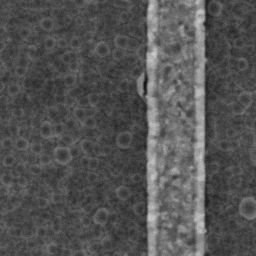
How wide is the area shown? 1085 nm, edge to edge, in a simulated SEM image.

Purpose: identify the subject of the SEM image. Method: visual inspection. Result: one or a few lines or trenches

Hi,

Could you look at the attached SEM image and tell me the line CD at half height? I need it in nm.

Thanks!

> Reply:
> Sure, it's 210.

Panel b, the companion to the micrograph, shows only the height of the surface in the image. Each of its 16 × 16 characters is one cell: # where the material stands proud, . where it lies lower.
.........####...
.........####...
.........####...
.........####...
.........####...
.........####...
.........####...
..........###...
..........###...
.........####...
.........####...
.........####...
.........####...
.........####...
.........####...
.........####...